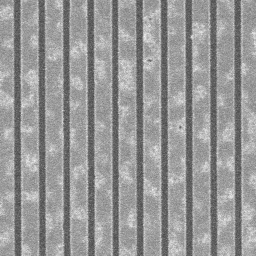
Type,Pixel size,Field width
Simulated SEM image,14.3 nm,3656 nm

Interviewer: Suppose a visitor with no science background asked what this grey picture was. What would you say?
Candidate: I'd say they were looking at parallel lines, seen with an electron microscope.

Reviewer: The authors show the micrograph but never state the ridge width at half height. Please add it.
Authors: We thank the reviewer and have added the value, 237 nm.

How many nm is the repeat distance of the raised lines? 349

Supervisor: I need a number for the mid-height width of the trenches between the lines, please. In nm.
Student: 107